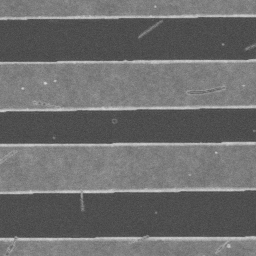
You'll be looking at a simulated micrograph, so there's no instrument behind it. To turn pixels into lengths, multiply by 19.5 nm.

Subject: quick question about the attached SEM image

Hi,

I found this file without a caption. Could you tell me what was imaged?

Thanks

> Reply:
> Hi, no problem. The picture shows lines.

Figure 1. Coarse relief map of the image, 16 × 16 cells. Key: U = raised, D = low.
UUUUUUUUUUUUUUUU
DDDDDDDDDDDDDDDD
DDDDDDDDDDDDDDDD
DDDDDDDDDDDDDDDD
UUUUUUUUUUUUUUUU
UUUUUUUUUUUUUUUU
UUUUUUUUUUUUUUUU
DDDDDDDDDDDDDDDD
DDDDDDDDDDDDDDDD
UUUUUUUUUUUUUUUU
UUUUUUUUUUUUUUUU
UUUUUUUUUUUUUUUU
DDDDDDDDDDDDDDDD
DDDDDDDDDDDDDDDD
DDDDDDDDDDDDDDDD
UUUUUUUUUUUUUUUU